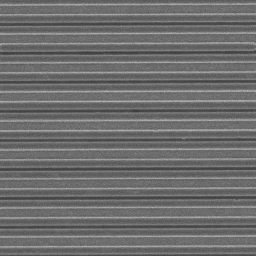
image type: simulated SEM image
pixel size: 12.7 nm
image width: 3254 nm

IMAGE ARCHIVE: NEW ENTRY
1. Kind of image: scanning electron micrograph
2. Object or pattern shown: parallel lines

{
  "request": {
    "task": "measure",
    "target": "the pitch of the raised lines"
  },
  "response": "184 nm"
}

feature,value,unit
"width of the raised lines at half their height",98.5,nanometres